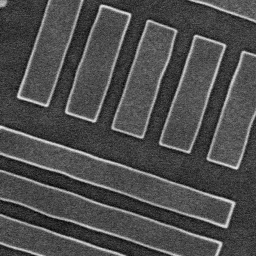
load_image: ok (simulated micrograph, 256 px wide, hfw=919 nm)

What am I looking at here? groups of lines, slits or small figures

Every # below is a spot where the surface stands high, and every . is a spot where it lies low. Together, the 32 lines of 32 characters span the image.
......####...............#######
......####..###.............####
.....#####..####...............#
.....####...####..###...........
.....####..####...####..........
....#####..####..#####..####....
....####...####..####...####....
....####..#####..####..#####..##
...#####..####..#####..####...##
...####..#####..####...####..###
...####..#####..####..#####..###
..#####..####..#####..####...###
...###...####..####...####..####
........#####..####..#####..####
..........##..#####..####...####
..............####...####..####.
##.............###..#####..####.
#####...............####...####.
########.............###..#####.
.##########...............####..
....###########.............##..
#......###########..............
####......###########...........
#######......###########........
##########......###########.....
..###########......##########...
.....###########......#######...
##......###########.......###...
#####......###########..........
########.......##########.......
###########......##########.....
....##########.......######.....